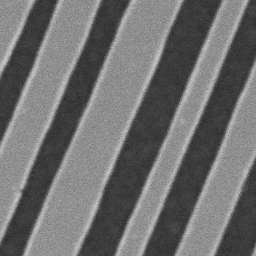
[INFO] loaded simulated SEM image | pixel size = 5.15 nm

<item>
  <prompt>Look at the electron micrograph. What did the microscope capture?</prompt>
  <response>one or a few lines or trenches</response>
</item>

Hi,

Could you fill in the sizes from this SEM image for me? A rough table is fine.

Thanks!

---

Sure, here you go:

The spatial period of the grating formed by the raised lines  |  358 nm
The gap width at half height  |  166 nm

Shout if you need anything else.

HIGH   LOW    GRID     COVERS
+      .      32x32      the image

++++...+++++....+++++++.....+++.
++++...+++++....++++++.....+++..
+++....+++++...+++++++.....+++..
+++...+++++....++++++.....++++..
++....+++++....++++++.....+++...
++...+++++....++++++......+++...
+....+++++....++++++.....+++....
+....+++++...+++++++.....+++....
....+++++....++++++......++.....
....+++++....++++++.....+++....+
...+++++....++++++......+++....+
...+++++....++++++.....+++....++
...++++....+++++++.....+++....++
..+++++....++++++.....+++.....++
..+++++...+++++++.....+++....+++
.+++++....++++++......+++....+++
.+++++....++++++.....+++....++++
.++++....++++++......+++....++++
+++++....++++++.....+++.....++++
++++....++++++......+++....+++++
++++....++++++.....+++.....++++.
+++....+++++++.....+++....+++++.
+++....++++++......++.....++++..
+++...+++++++.....+++.....++++..
++....+++++++.....+++....+++++..
++....++++++.....+++.....++++...
++...+++++++.....+++....+++++...
+....++++++.....+++.....++++....
+...+++++++.....+++....+++++....
....+++++++.....+++....+++++....
....++++++.....+++.....++++.....
...+++++++.....+++....+++++.....